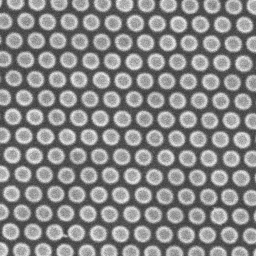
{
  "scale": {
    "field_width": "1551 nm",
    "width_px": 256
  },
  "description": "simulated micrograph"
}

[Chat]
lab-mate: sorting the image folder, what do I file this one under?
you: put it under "a regular array of raised bodies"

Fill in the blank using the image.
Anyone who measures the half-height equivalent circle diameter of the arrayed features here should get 94.7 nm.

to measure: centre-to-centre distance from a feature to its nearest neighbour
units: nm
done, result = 131